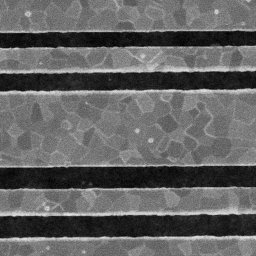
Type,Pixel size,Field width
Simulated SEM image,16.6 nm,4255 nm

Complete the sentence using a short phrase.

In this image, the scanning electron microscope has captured lines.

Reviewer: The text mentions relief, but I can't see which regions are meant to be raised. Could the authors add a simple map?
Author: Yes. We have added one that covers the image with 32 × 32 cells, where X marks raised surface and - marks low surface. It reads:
XXXXXXXXXXXXXXXXXXXXXXXXXXXXXXXX
XXXXXXXXXXXXXXXXXXXXXXXXXXXXXXXX
XXXXXXXXXXXXXXXXXXXXXXXXXXXXXXXX
XXXXXXXXXXXXXXXXXXXXXXXXXXXXXXXX
--------------------------------
--------------------------------
XXXXXXXXXXXXXXXXXXXXXXXXXXXXXXXX
XXXXXXXXXXXXXXXXXXXXXXXXXXXXXXXX
XXXXXXXXXXXXXXXXXXXXXXXXXXXXXXXX
--------------------------------
--------------------------------
-----------XXXXXXXXXXXXXXXXXXXXX
XXXXXXXXXXXXXXXXXXXXXXXXXXXXXXXX
XXXXXXXXXXXXXXXXXXXXXXXXXXXXXXXX
XXXXXXXXXXXXXXXXXXXXXXXXXXXXXXXX
XXXXXXXXXXXXXXXXXXXXXXXXXXXXXXXX
XXXXXXXXXXXXXXXXXXXXXXXXXXXXXXXX
XXXXXXXXXXXXXXXXXXXXXXXXXXXXXXXX
XXXXXXXXXXXXXXXXXXXXXXXXXXXXXXXX
XXXXXXXXXXXXXXXXXXXXXXXXXXXXXXXX
XXXXXXXXXXXXXXXXXXXXXXXXXXXXXXXX
--------------------------------
--------------------------------
-----------------------------XX-
XXXXXXXXXXXXXXXXXXXXXXXXXXXXXXXX
XXXXXXXXXXXXXXXXXXXXXXXXXXXXXXXX
XXXXXXXXXXXXXXXXXXXXXXXXXXXXXXXX
--------------------------------
--------------------------------
--------------------------------
XXXXXXXXXXXXXXXXXXXXXXXXXXXXXXXX
XXXXXXXXXXXXXXXXXXXXXXXXXXXXXXXX